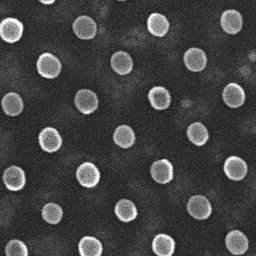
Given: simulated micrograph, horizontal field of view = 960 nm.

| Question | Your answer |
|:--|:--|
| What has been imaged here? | a regular array of raised bodies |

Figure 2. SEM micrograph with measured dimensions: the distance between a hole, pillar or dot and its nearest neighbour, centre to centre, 0.193 µm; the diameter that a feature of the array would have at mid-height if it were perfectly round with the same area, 0.0839 microns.